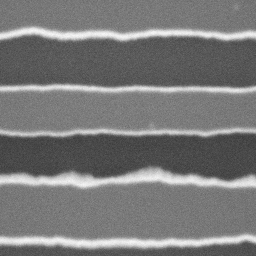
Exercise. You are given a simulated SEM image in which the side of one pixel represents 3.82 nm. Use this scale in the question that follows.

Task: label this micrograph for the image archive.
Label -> lines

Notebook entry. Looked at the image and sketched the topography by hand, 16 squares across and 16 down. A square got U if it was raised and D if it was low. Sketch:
UUUUUUUUUUUUUUUU
UUUUUUUUUUUUUUUU
DDDDDDDDDDDDDDDD
DDDDDDDDDDDDDDDD
DDDDDDDDDDDDDDDD
DUUUUDDDDDDDDDDD
UUUUUUUUUUUUUUUU
UUUUUUUUUUUUUUUU
DDDDDDDDDDDDDDDD
DDDDDDDDDDDDDDDD
DDDDDDDDDDDDDDDD
UUUUUUUUUUUUUUUU
UUUUUUUUUUUUUUUU
UUUUUUUUUUUUUUUU
UUUUUUUUUUUUUUUU
DDDDDDDDDDDDDDDD